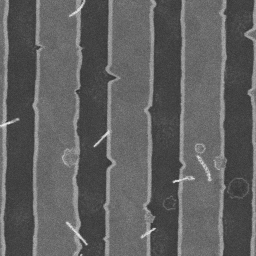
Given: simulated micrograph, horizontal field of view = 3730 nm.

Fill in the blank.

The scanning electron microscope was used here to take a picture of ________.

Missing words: one or a few lines or trenches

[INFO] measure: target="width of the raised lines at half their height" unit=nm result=603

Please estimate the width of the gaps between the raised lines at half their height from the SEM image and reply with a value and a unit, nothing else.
459 nanometres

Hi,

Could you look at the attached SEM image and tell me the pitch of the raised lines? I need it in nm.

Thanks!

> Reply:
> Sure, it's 1060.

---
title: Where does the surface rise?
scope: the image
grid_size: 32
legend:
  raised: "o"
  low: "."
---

o....ooooo....ooooo....ooooo....
o....ooooo....ooooo....ooooo....
o....ooooo....ooooo....ooooo....
o....ooooo....ooooo....ooooo....
o....ooooo....ooooo....ooooo...o
o....ooooo....ooooo....ooooo....
o....ooooo....ooooo....ooooo....
o....ooooo....ooooo....ooooo....
o....ooooo....ooooo....ooooo....
o....ooooo....ooooo....ooooo....
o....ooooo....ooooo....ooooo....
o....ooooo....ooooo....ooooo...o
o....ooooo....ooooo....ooooo....
o...oooooo....ooooo....ooooo....
o....ooooo....ooooo....ooooo....
o....oooo.....ooooo....ooooo....
o....oooo....oooooo....ooooo....
.....ooooo....ooooo....ooooo....
.....ooooo....ooooo....ooooo....
o...oooooo....ooooo....ooooo....
o...oooooo....ooooo....ooooo....
o...ooooo.....ooooo....ooooo....
....ooooo.....ooooo...oooooo....
....ooooo.....ooooo....ooooo....
....ooooo.....ooooo....ooooo....
....ooooo....ooooo.....ooooo....
....oooooo...oooooo....ooooo....
.....ooooo...oooooo....ooooo....
.....ooooo...oooooo....ooooo....
....oooooo...oooooo....ooooo....
....oooooo...oooooo...oooooo....
....oooooo...oooooo...oooooo....